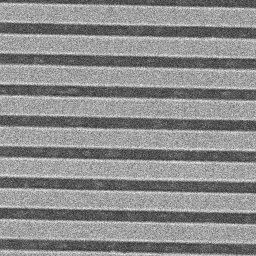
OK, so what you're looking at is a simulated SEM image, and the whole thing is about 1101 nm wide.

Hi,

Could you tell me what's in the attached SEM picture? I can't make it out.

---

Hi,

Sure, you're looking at parallel lines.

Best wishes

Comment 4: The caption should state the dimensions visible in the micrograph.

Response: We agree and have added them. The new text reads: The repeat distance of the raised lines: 133 nanometres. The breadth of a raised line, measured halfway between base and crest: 19.2 px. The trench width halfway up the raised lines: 0.051 µm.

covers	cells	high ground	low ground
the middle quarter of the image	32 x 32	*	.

................................
********************************
********************************
********************************
********************************
...........*********************
................................
................................
************....................
********************************
********************************
********************************
********************************
......................**********
................................
................................
***********************.........
********************************
********************************
********************************
********************************
...............................*
................................
................................
********************************
********************************
********************************
********************************
.......*************************
................................
................................
................................